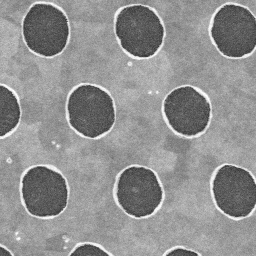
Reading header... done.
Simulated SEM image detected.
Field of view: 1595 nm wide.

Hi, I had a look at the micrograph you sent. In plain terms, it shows holes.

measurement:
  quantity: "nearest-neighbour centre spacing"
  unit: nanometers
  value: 582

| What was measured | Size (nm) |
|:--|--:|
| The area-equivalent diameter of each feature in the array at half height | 316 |